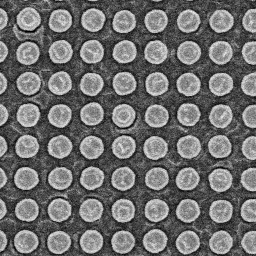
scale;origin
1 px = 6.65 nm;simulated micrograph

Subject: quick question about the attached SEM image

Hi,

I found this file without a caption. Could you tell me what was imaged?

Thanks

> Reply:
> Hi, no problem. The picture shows a regular array of raised bodies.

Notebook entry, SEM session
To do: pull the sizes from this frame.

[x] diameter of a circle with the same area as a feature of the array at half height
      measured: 142 nm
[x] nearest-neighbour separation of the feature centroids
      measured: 0.206 um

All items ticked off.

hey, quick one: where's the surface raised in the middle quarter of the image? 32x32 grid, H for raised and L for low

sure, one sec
LLLLLLLLLLLLLLLLLLLLLLLLLLLLLLLL
LLLLLLLLLLLLLLLLLLLLLLLLLLLLLLLL
HLLLLLLLLLLLLLHHLLLLLLHHLLLLLLHH
HLLLLHHHHLLLLHHHHLLLLHHHHLLLLHHH
HHLLHHHHHLLLLHHHHHLLLHHHHHLLHHHH
HHLLHHHHHLLLLHHHHHLLLHHHHHLLHHHH
HLLLLHHHHLLLLHHHHLLLLHHHHLLLLHHH
LLLLLLHHLLLLLLLLLLLLLLHLLLLLLLLH
LLLLLLLLLLLLLLLLLLLLLLLLLLLLLLLL
LLLLLLLLLLLLLLLLLLLLLLLLLLLLLLLL
LLLLLLHHHLLLLLHHLLLLLLLLLLLLLLHH
HLLLLHHHHLLLLHHHHLLLLHHHHHLLLHHH
HHLLHHHHHLLLHHHHHLLLLHHHHHLLLHHH
HHLLHHHHHLLLHHHHHLLLLHHHHHLLLHHH
HLLLLHHHHLLLLHHHHLLLLHHHHHLLLHHH
LLLLLLLLLLLLLLLLLLLLLLHHLLLLLLLL
LLLLLLLLLLLLLLLLLLLLLLLLLLLLLLLL
LLLLLLLLLLLLLLLLLLLLLLLLLLLLLLLL
LLLLLLHHLLLLLLHHLLLLLLHHLLLLLLHH
HLLLLHHHHLLLLHHHHLLLLHHHHLLLLHHH
HHLLHHHHHHLLHHHHHLLLHHHHHHLLLHHH
HHLLHHHHHHLLHHHHHLLLHHHHHHLLLHHH
HLLLLHHHHLLLLHHHHLLLLHHHHLLLLHHH
LLLLLLHLLLLLLLLLLLLLLLHLLLLLLLLL
LLLLLLLLLLLLLLLLLLLLLLLLLLLLLLLL
LLLLLLLLLLLLLLLLLLLLLLLLLLLLLLLL
HLLLLHHHHLLLLHHHLLLLLLHHHLLLLLHH
HHLLLHHHHHLLHHHHHLLLLHHHHHLLLHHH
HHLLLHHHHHLLHHHHHLLLLHHHHHLLHHHH
HHLLLHHHHLLLHHHHHLLLLHHHHHLLHHHH
HLLLLHHHLLLLLHHHHLLLLHHHHLLLLHHH
LLLLLLLLLLLLLLLLLLLLLLLLLLLLLLLL